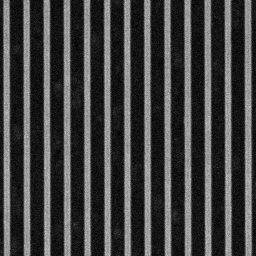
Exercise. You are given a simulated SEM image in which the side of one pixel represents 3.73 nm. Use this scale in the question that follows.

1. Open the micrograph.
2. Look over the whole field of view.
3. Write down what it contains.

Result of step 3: parallel lines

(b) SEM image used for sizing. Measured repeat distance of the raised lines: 75.1 nm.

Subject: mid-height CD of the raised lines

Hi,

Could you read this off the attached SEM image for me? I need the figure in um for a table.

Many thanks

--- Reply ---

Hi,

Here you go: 0.021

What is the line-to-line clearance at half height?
0.0527 microns